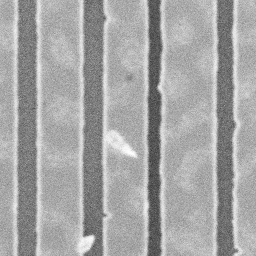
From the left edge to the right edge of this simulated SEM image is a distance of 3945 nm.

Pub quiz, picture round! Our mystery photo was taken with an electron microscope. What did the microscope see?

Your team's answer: one or a few lines or trenches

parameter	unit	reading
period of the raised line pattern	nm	991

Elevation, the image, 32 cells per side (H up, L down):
HHLLLHHHHHLLLHHHHHLLHHHHHHHLLHHH
HHLLLHHHHHLLLHHHHHLLHHHHHHHLLHHH
HHLLLHHHHHLLLHHHHHLLHHHHHHHLLHHH
HHLLLHHHHHLLLHHHHHLLHHHHHHHLLHHH
HHLLLHHHHHLLLHHHHHLLHHHHHHHLLHHH
HHLLLHHHHHLLLHHHHHLLHHHHHHHLLHHH
HHLLLHHHHHLLLHHHHHLLHHHHHHHLLHHH
HHLLLHHHHHLLLHHHHHLLHHHHHHHLLHHH
HHLLLHHHHHLLLHHHHHLLHHHHHHHLLHHH
HHLLLHHHHHLLLHHHHHLLHHHHHHHLLHHH
HHLLLHHHHHLLLHHHHHLLHHHHHHHLLHHH
HHLLLHHHHHLLLHHHHHLLHHHHHHHLLHHH
HHLLLHHHHHLLLHHHHHLLHHHHHHHLLHHH
HHLLLHHHHHLLLHHHHHLLHHHHHHHLLHHH
HHLLLHHHHHLLLHHHHHLLHHHHHHHLLHHH
HHLLLHHHHHLLLHHHHHLLHHHHHHHLLLHH
HHLLLHHHHHLLLHHHHHLLHHHHHHHLLHHH
HHLLLHHHHHLLLHHHHHLLHHHHHHHLLHHH
HHLLLHHHHHLLLHHHHHLLHHHHHHHLLHHH
HHLLLHHHHHLLLHHHHHLLHHHHHHHLLHHH
HHLLLHHHHHLLLHHHHHLLHHHHHHHLLHHH
HHLLLHHHHHLLLHHHHHLLHHHHHHHLLHHH
HHLLLHHHHHLLLHHHHHLLHHHHHHHLLHHH
HHLLLHHHHHLLLHHHHHLLHHHHHHHLLHHH
HHLLLHHHHHLLLHHHHHLLHHHHHHHLLHHH
HHLLLHHHHHLLLHHHHHLLHHHHHHHLLHHH
HHLLLHHHHHLLLHHHHHLLHHHHHHHLLHHH
HHLLLHHHHHLLLHHHHHLLHHHHHHHLLHHH
HHLLLHHHHHLLLHHHHHLLHHHHHHHLLHHH
HHLLLHHHHHHLLHHHHHLLHHHHHHHLLHHH
HHLLLHHHHHHLLHHHHHLLHHHHHHHLLHHH
HHLLLHHHHHHLLHHHHHLLHHHHHHHLLLHH